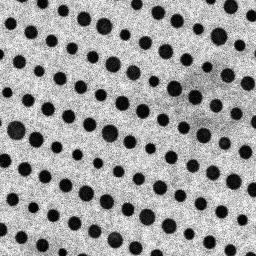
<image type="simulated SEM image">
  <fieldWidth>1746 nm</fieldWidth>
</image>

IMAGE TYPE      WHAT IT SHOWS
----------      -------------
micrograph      a regular array of holes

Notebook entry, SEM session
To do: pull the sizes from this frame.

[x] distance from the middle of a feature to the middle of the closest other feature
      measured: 0.149 um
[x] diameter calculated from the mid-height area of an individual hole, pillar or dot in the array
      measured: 88.7 nm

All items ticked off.